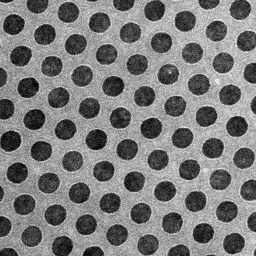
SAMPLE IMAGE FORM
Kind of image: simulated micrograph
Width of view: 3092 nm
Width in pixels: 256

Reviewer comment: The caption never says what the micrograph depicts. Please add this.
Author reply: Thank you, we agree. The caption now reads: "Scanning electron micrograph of a regular array of holes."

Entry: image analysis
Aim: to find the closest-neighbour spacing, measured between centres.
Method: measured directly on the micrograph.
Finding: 388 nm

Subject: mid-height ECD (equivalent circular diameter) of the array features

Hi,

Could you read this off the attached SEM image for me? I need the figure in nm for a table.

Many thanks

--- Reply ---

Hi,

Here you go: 269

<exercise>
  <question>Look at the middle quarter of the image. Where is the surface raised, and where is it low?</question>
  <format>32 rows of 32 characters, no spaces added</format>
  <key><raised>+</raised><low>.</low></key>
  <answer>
++++..++++++++++.....++++...++++
++.....+++++++++.....++......+++
++.....++++++++++...+++......+++
++.....++++...+++++++++......++.
++.....+++.....+++++++++....+++.
+++...+++......+++++.++++++++++.
.++++++++......+++....+++++++++.
..++++++++....+++......+++++++++
..+++..++++++++++......+++....++
.+++.....+++++++++....+++......+
++++.....+++++++++...++++......+
++++.....+++....+++++++++.....++
++++.....+++.....+++++++++....++
+++++...+++......++++..+++++++++
..+++++++++......+++....++++++++
...+++++++++....+++......+++++++
...++++..++++++++++......+++....
...+++.....++++++++.....+++.....
..+++......+++++++++...++++.....
+++++......+++....+++++++++.....
++++++....+++......+++++++++...+
++.++++..++++......++++..+++++++
....+++++++++.....+++.....++++++
.....+++++++++....+++.....++++++
.....++++..++++++++++.....+++...
.....++......++++++++.....+++...
....+++......++++++++++..+++....
+++++++......+++....+++++++++...
++++++++....+++.....+++++++++...
++++.++++.+++++.....++++...+++++
++....+++++++++.....+++.....++++
+......+++++++++...+++......++++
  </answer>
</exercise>